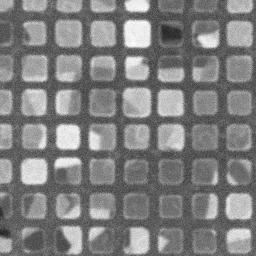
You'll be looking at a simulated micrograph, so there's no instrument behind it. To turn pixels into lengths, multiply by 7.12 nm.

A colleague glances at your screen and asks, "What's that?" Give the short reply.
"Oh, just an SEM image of a regular array of raised bodies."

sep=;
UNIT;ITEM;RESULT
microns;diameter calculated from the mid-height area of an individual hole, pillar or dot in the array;0.19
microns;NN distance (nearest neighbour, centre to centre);0.241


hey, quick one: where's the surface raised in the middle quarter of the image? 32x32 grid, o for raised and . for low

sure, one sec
oooo...ooooo....ooooo...oooooo..
oooo...ooooo....ooooo...oooooo..
oooo...ooooo....ooooo...oooooo..
oooo...ooooo....oooo....oooooo..
................................
................................
.......oo.......ooooo...........
oooo...oooooo..oooooo...oooooo..
oooo...oooooo..oooooo...oooooo..
oooo...oooooo..oooooo...oooooo..
oooo...oooooo..oooooo...oooooo..
oooo...oooooo..oooooo...oooooo..
.......ooooo...oooooo...ooooo...
................................
................................
ooo....oooooo...........ooooo...
oooo...oooooo..oooooo...oooooo..
oooo...oooooo..oooooo...oooooo..
oooo...oooooo..oooooo...oooooo..
oooo...oooooo..oooooo...oooooo..
oooo...oooooo...ooooo...oooooo..
........................ooooo...
................................
................................
oooo...ooooo....ooooo...ooooo...
oooo...ooooo...oooooo...oooooo..
oooo...ooooo...oooooo...oooooo..
oooo...ooooo...oooooo...oooooo..
oooo...ooooo...oooooo...oooooo..
oooo...ooooo....oooo....ooooo...
................................
................................